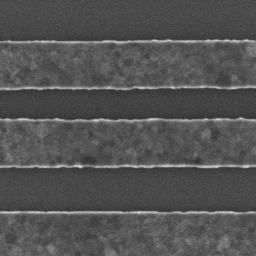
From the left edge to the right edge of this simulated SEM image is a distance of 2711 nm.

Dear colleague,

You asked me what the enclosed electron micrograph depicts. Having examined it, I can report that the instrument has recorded lines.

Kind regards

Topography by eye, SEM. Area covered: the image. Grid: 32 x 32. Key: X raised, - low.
--------------------------------
--------------------------------
--------------------------------
--------------------------------
--------------------------------
XXXXXXXXXXXXXXXXXXXXXXXXXXXXXXXX
XXXXXXXXXXXXXXXXXXXXXXXXXXXXXXXX
XXXXXXXXXXXXXXXXXXXXXXXXXXXXXXXX
XXXXXXXXXXXXXXXXXXXXXXXXXXXXXXXX
XXXXXXXXXXXXXXXXXXXXXXXXXXXXXXXX
XXXXXXXXXXXXXXXXXXXXXXXXXXXXXXXX
--------------------------------
--------------------------------
--------------------------------
--------------------------------
XXXXXXXXXXXXXXXXXXXXXXXXXXXXXXXX
XXXXXXXXXXXXXXXXXXXXXXXXXXXXXXXX
XXXXXXXXXXXXXXXXXXXXXXXXXXXXXXXX
XXXXXXXXXXXXXXXXXXXXXXXXXXXXXXXX
XXXXXXXXXXXXXXXXXXXXXXXXXXXXXXXX
XXXXXXXXXXXXXXXXXXXXXXXXXXXXXXXX
--------------------------------
--------------------------------
--------------------------------
--------------------------------
--------------------------------
--------------------------------
XXXXXXXXXXXXXXXXXXXXXXXXXXXXXXXX
XXXXXXXXXXXXXXXXXXXXXXXXXXXXXXXX
XXXXXXXXXXXXXXXXXXXXXXXXXXXXXXXX
XXXXXXXXXXXXXXXXXXXXXXXXXXXXXXXX
XXXXXXXXXXXXXXXXXXXXXXXXXXXXXXXX